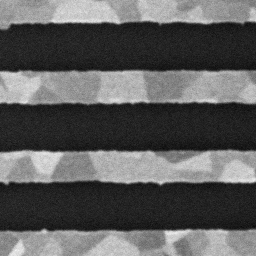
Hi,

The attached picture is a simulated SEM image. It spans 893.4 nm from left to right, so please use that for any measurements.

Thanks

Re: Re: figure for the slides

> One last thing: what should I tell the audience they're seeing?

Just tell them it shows lines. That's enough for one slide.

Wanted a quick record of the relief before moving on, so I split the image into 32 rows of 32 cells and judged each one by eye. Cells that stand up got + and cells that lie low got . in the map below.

++++++++++++++++++++++++++++++++
++++++++++++++++++++++++++++++++
++++++++++++++++++++++++++++++++
................................
................................
................................
................................
................................
................................
++++++++++++++++++++++++++++++++
++++++++++++++++++++++++++++++++
++++++++++++++++++++++++++++++++
++++++++++++++++++++++++++++++++
................................
................................
................................
................................
................................
................................
++++++++++++++++++++++++++++++++
++++++++++++++++++++++++++++++++
++++++++++++++++++++++++++++++++
++++++++++++++++++++++++++++++++
................................
................................
................................
................................
................................
................................
++++++++++++++++++++++++++++++++
++++++++++++++++++++++++++++++++
++++++++++++++++++++++++++++++++